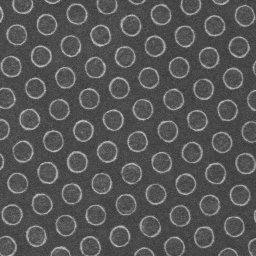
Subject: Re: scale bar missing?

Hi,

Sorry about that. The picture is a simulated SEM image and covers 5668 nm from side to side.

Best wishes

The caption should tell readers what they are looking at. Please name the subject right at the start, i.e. a regular array of raised bodies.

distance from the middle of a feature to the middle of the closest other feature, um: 0.697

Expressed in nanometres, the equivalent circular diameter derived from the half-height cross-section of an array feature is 443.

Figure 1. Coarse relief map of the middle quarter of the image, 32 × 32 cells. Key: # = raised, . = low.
.....#####....##..........#####.
##....####..........###...#####.
###...####.........####....####.
###................#####........
###.........####...#####........
##..........####....###.........
.....##.....####...........#....
....####....####.........####...
....#####................#####..
....#####.........###....#####..
#....###..........####....###...
#................#####..........
#.........####....####.........#
..........#####...###..........#
....##....#####..........##....#
...####....###..........####...#
..#####.....#...........####....
...####..........###....####....
...###..........#####...####....
................#####...........
.........####...####..........##
.........####....###..........##
..###...#####..........##.....##
.####....####.........####....##
.#####................#####....#
.#####.........###....#####.....
..###..........####....###......
.........#.....####.............
.......#####...####..........###
.......#####....##..........####
.##....#####..........##....####
####....###..........####....###